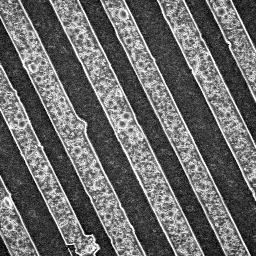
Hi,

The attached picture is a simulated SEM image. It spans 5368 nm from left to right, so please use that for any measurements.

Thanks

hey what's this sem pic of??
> parallel lines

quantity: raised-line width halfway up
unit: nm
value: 503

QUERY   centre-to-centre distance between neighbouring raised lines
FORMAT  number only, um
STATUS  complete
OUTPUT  0.993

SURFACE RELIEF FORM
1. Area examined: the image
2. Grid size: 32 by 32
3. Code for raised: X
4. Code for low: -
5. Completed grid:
XXX---XXXX---XXX----XXX---XXX---
XXX----XXX---XXX----XXXX---XXX--
XXXX---XXXX---XXX----XXX---XXX--
-XXX----XXX---XXX----XXXX--XXXX-
-XXXX---XXXX---XXX----XXX---XXX-
--XXX----XXX---XXX----XXXX---XX-
--XXXX---XXXX---XXX----XXX---XXX
---XXX----XXX---XXX----XXXX--XXX
---XXXX---XXXX---XXX----XXX---XX
X---XXX----XXX---XXX----XXXX--XX
X---XXXX---XXXX---XXX----XXX---X
XX---XXX----XXX---XXX----XXXX--X
XX---XXXX---XXXX---XXX----XXX---
XXX---XXX----XXX---XXX----XXXX--
XXX---XXXX---XXXX---XXX----XXX--
-XXX---XXXX---XXX---XXX----XXXX-
-XXX---XXXX---XXXX---XXX----XXX-
--XXX---XXX----XXX---XXX----XXXX
--XXX---XXXX---XXXX---XXX----XXX
---XXX---XXX----XXX---XXX----XXX
---XXX---XXXX---XXXX---XXX----XX
----XXX---XXX----XXX---XXX----XX
----XXX---XXXX---XXXX---XXX----X
X----XXX---XXX----XXX---XXX----X
X----XXX---XXXX---XXXX---XXX----
XX----XXX---XXX----XXX---XXX----
XX----XXX---XXXX---XXXX---XX----
XXX----XXX---XXX----XXX---XXX---
XXX----XXX---XXXX---XXXX---XXX--
XXXX----XXX---XXX----XXX---XXX--
-XXX-----XXX--XXX----XXXX---XX--
-XXXX-----XX---XXX----XXX---XXX-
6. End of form